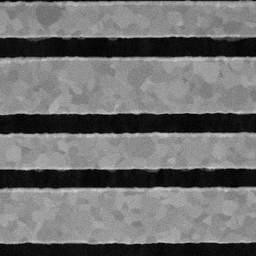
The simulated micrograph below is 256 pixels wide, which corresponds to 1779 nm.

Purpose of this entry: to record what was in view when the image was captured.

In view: lines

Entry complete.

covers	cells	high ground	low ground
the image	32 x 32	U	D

UUUUUUUUUUUUUUUUUUUUUUUUUUUUUUUU
UUUUUUUUUUUUUUUUUUUUUUUUUUUUUUUU
UUUUUUUUUUUUUUUUUUUUUUUUUUUUUUUU
UUUUUUUUUUUUUUUUUUUUUUUUUUUUUUUU
UUUUUUUUUUUUUUUUUUUUUUUUUUUUUUUU
DDDDDDDDDDDDDDDDDDDDDDDDDDDDDDDD
DDDDDDDDDDDDDDDDDDDDDDDDDDDDDDDD
UUUUUUUUUUUUUUUUUUUUUUUUUUUUUUUU
UUUUUUUUUUUUUUUUUUUUUUUUUUUUUUUU
UUUUUUUUUUUUUUUUUUUUUUUUUUUUUUUU
UUUUUUUUUUUUUUUUUUUUUUUUUUUUUUUU
UUUUUUUUUUUUUUUUUUUUUUUUUUUUUUUU
UUUUUUUUUUUUUUUUUUUUUUUUUUUUUUUU
UUUUUUUUUUUUUUUUUUUUUUUUUUUUUUUU
DDDDDDDDDDDDDDDDDDDDDDDDDDDDDDDD
DDDDDDDDDDDDDDDDDDDDDDDDDDDDDDDD
DDDDDDDDDDDDDDDDDDDDDDDDDDDDDDDD
UUUUUUUUUUUUUUUUUUUUUUUUUUUUUUUU
UUUUUUUUUUUUUUUUUUUUUUUUUUUUUUUU
UUUUUUUUUUUUUUUUUUUUUUUUUUUUUUUU
UUUUUUUUUUUUUUUUUUUUUUUUUUUUUUUU
DDDDDDDDDDDDDDDDDDDDDDDDDDDDDDDD
DDDDDDDDDDDDDDDDDDDDDDDDDDDDDDDD
DDDDDDDDDDDDDDDDDDDUUUUDDDUUDUUU
UUUUUUUUUUUUUUUUUUUUUUUUUUUUUUUU
UUUUUUUUUUUUUUUUUUUUUUUUUUUUUUUU
UUUUUUUUUUUUUUUUUUUUUUUUUUUUUUUU
UUUUUUUUUUUUUUUUUUUUUUUUUUUUUUUU
UUUUUUUUUUUUUUUUUUUUUUUUUUUUUUUU
UUUUUUUUUUUUUUUUUUUUUUUUUUUUUUUU
DDDDDDDDDDDDDDDDDDDDDDDDDDDDDDDD
DDDDDDDDDDDDDDDDDDDDDDDDDDDDDDDD